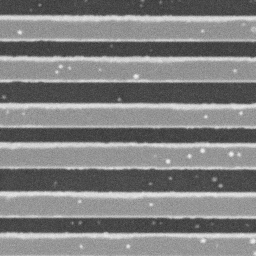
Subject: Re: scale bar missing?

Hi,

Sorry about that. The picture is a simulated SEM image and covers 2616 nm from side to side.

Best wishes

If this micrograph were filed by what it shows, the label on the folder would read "lines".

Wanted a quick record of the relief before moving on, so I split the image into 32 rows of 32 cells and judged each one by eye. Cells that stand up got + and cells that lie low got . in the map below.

................................
................................
++++++++++++++++++++++++++++++++
++++++++++++++++++++++++++++++++
++++++++++++++++++++++++++++++++
................................
................................
++++++++++++++++++++++++++++++++
++++++++++++++++++++++++++++++++
++++++++++++++++++++++++++++++++
................................
................................
................................
++++++++++++++++++++++++++++++++
++++++++++++++++++++++++++++++++
++++++++++++++++++++++++++++++++
................................
................................
++++++++++++++++++++++++++++++++
++++++++++++++++++++++++++++++++
++++++++++++++++++++++++++++++++
................................
................................
................................
++++++++++++++++++++++++++++++++
++++++++++++++++++++++++++++++++
++++++++++++++++++++++++++++++++
................................
................................
++++++++++++++++++++++++++++++++
++++++++++++++++++++++++++++++++
++++++++++++++++++++++++++++++++